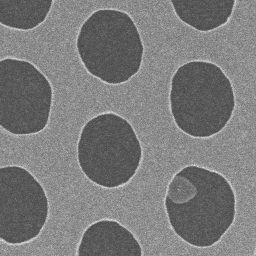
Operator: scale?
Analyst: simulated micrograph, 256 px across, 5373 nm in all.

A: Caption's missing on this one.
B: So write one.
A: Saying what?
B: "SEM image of holes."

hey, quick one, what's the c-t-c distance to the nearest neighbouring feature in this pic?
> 2200 nm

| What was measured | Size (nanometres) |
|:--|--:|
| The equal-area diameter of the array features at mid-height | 1460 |